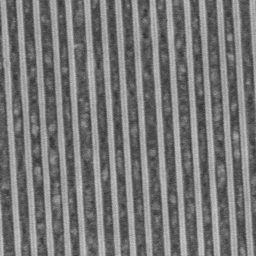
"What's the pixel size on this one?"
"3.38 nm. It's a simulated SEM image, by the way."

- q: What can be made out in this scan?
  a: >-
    parallel lines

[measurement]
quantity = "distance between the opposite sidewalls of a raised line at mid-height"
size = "0.0156 micrometres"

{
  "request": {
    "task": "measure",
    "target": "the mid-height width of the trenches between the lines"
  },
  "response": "11.7 px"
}